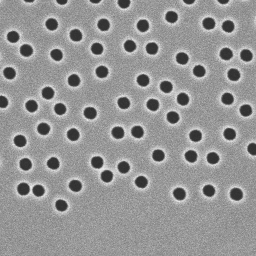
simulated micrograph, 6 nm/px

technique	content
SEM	a regular array of holes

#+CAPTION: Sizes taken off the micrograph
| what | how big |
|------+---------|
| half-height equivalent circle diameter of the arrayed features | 71.7 nanometers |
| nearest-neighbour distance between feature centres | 22.3 px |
